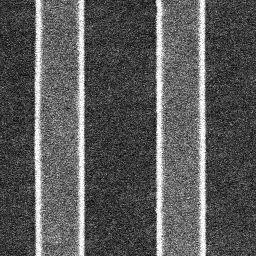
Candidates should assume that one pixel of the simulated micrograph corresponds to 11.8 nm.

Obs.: one or a few lines or trenches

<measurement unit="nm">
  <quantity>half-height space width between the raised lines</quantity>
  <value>904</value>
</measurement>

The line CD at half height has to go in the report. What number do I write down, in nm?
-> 511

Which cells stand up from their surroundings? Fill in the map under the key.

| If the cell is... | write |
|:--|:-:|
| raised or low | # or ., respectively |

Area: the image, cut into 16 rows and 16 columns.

..###.....###...
..###.....###...
..###.....###...
..###.....###...
..###.....###...
..###.....###...
..###.....###...
..###.....###...
..###.....###...
..###.....###...
..###.....###...
..###.....###...
..###.....###...
..###.....###...
..###.....###...
..###.....###...